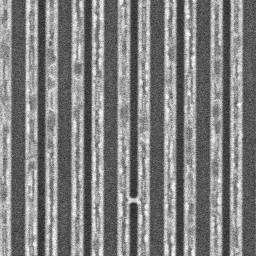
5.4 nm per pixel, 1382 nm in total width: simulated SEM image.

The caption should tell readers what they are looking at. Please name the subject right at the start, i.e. parallel lines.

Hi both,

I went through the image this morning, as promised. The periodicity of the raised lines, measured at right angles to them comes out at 123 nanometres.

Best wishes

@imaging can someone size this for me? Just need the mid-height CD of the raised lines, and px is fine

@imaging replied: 11.1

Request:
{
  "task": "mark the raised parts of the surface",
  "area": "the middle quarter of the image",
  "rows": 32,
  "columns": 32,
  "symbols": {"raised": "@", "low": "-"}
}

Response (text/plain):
--@@@--@@@----@@---@@----@@@--@@
--@@@--@@@----@@---@@----@@@--@@
--@@@--@@@----@@---@@----@@@--@@
--@@@--@@@----@@---@@----@@@--@@
--@@@--@@@----@@---@@----@@@--@@
--@@@--@@@----@@---@@----@@@--@@
--@@@--@@@----@@---@@----@@@--@@
--@@@--@@@----@@---@@----@@@--@@
--@@@--@@@----@@---@@----@@@--@@
--@@@--@@@----@@---@@----@@@--@@
--@@@--@@@----@@---@@----@@@--@@
--@@@--@@@----@@---@@----@@@--@@
--@@@--@@@----@@---@@----@@@--@@
--@@@--@@@----@@---@@----@@@--@@
--@@@--@@@----@@---@@----@@@--@@
--@@@--@@@----@@---@@----@@@--@@
--@@@--@@@----@@---@@----@@@--@@
--@@@--@@@----@@---@@----@@@--@@
--@@@--@@@----@@---@@----@@@--@@
--@@@--@@@----@@---@@----@@@--@@
--@@@--@@@----@@---@@----@@@--@@
--@@@--@@@----@@---@@----@@@--@@
--@@@--@@@----@@---@@----@@@--@@
--@@@--@@@----@@---@@----@@@--@@
--@@@--@@@----@@---@@----@@@--@@
--@@@--@@@----@@---@@----@@@--@@
--@@@--@@@----@@---@@----@@@--@@
--@@@--@@@----@@---@@----@@@--@@
--@@@--@@@----@@---@@----@@@--@@
--@@@--@@@----@@---@@----@@@--@@
--@@@--@@@----@@---@@----@@@--@@
--@@@--@@@----@@---@@----@@@--@@